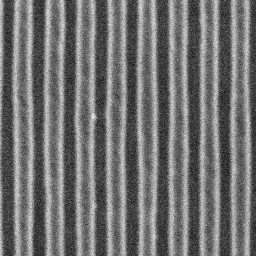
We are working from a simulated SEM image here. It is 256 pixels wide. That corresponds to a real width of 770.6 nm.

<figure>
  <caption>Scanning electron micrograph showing parallel lines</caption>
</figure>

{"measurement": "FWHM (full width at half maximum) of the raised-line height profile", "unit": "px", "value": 17.1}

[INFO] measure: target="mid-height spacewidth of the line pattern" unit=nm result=41.4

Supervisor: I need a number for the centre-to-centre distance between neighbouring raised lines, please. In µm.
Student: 0.0935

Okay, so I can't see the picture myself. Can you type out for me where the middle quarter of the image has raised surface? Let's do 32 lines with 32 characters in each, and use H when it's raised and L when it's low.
LLLHHHHLLLLHHHHLLLLHHHHLLLLHHHLL
LLLHHHHLLLLHHHHLLLLHHHHLLLLHHHLL
LLLHHHHLLLLHHHHLLLLHHHHLLLLHHHLL
LLLHHHHLLLLHHHHLLLLHHHHLLLLHHHLL
LLLHHHHLLLLHHHHLLLLHHHHLLLLHHHLL
LLLHHHHLLLLHHHHLLLLHHHHLLLLHHHLL
LLLHHHHLLLLHHHHLLLLHHHHLLLLHHHLL
LLLHHHHLLLLHHHHLLLLHHHHLLLLHHHLL
LLLHHHHLLLLHHHHLLLLHHHHLLLLHHHLL
LLLHHHHLLLLHHHHLLLLHHHHLLLLHHHHL
LLLHHHHLLLLHHHHLLLLHHHHLLLLHHHHL
LLLHHHHLLLLHHHHLLLLHHHHLLLLHHHHL
LLLHHHHHLLLHHHHLLLLHHHHLLLLHHHHL
LLLHHHHHLLLHHHHLLLLHHHHLLLLHHHHL
LLLHHHHLLLLHHHHLLLLHHHHLLLLHHHHL
LLLHHHHLLLLHHHHLLLLHHHHLLLLHHHHL
LLLHHHHLLLLHHHHLLLLHHHHLLLLHHHHL
LLLHHHHLLLLHHHHLLLLHHHHLLLLHHHHL
LLLHHHHLLLLHHHHLLLLHHHHLLLLHHHHL
LLLHHHHLLLLHHHHLLLLHHHHLLLLHHHHL
LLLHHHHLLLLHHHHLLLLHHHHLLLHHHHHL
LLLHHHHLLLLHHHHLLLLHHHHLLLHHHHHL
LLLHHHHLLLLHHHHLLLLHHHHLLLHHHHHL
LLLHHHHLLLLHHHHLLLLHHHHLLLHHHHHL
LLLHHHHLLLLHHHHLLLLHHHHLLLHHHHHL
LLLHHHHLLLLHHHHLLLLHHHHLLLHHHHHL
LLLHHHHLLLLHHHHLLLLHHHHLLLHHHHHL
LLLHHHHLLLLHHHHLLLLHHHHLLLHHHHHL
LLLHHHHLLLLHHHHLLLLHHHHLLLHHHHHL
LLLHHHHLLLLHHHHLLLLHHHHLLLHHHHHL
LLLHHHHLLLLHHHHLLLLHHHHLLLHHHHHL
LLLHHHHLLLLHHHHLLLLHHHHLLLHHHHHL